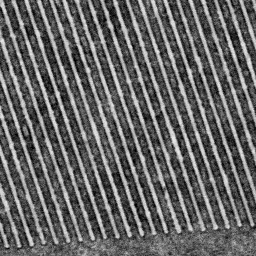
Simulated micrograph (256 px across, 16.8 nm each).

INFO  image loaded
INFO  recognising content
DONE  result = parallel lines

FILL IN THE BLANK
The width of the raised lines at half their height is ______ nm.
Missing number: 57.8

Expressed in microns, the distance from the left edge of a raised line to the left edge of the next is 0.201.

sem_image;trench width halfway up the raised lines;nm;143